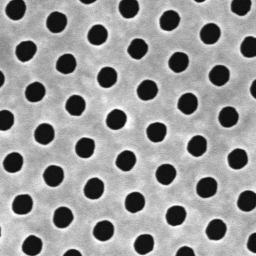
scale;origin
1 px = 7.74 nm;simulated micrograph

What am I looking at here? a regular array of holes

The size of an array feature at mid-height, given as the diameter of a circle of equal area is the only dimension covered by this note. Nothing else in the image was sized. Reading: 20.7 pixels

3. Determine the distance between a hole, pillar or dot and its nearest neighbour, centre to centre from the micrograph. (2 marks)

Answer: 326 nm